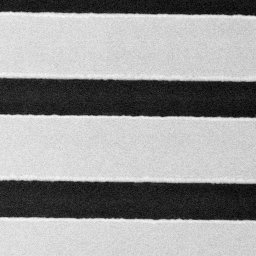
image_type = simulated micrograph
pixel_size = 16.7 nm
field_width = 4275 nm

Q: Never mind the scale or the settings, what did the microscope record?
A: lines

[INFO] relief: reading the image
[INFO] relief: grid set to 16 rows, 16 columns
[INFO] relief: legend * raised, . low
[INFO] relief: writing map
................
****************
****************
****************
****************
................
................
****************
****************
****************
****************
................
................
................
****************
****************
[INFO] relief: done